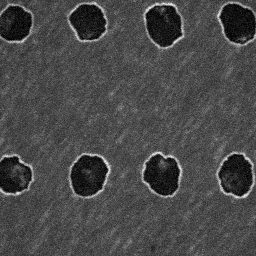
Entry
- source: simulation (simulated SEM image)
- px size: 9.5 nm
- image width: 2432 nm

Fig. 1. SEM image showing holes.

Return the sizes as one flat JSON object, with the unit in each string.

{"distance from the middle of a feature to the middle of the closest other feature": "0.706 microns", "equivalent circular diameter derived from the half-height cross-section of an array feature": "370 nm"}